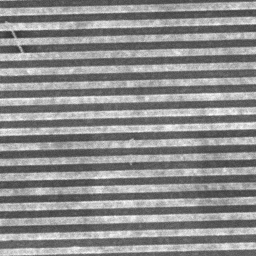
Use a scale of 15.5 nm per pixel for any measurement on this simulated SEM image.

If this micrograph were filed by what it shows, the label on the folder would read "parallel lines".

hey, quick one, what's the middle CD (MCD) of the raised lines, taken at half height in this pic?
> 105 nm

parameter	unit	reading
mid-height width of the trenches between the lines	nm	118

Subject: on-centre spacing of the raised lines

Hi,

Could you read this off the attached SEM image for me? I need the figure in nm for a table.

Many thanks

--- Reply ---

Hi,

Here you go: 233